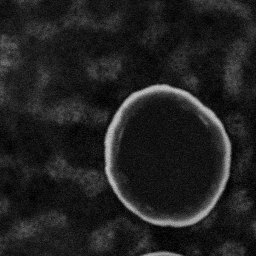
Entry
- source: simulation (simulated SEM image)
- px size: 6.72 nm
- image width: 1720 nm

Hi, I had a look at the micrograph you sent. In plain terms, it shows raised bodies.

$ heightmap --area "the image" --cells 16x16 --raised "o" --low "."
................
................
................
................
................
................
........oooo....
.......oooooo...
.......ooooooo..
.......ooooooo..
.......ooooooo..
.......ooooooo..
........ooooo...
.........ooo....
................
................